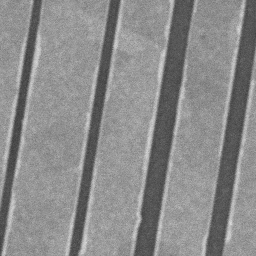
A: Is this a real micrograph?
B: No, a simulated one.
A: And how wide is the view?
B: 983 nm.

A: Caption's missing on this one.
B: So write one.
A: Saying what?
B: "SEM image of one or a few lines or trenches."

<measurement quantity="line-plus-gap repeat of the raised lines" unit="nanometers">273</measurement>